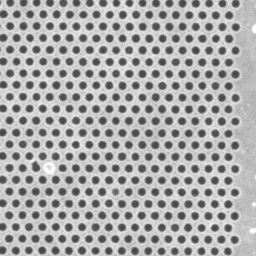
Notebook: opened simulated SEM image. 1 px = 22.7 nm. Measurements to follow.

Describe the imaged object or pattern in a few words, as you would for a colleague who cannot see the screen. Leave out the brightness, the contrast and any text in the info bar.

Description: a regular array of holes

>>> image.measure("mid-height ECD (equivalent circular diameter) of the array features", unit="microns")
0.204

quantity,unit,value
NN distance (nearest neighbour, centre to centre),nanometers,297